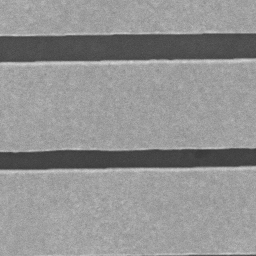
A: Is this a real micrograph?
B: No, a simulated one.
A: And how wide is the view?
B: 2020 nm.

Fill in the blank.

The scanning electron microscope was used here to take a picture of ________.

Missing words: lines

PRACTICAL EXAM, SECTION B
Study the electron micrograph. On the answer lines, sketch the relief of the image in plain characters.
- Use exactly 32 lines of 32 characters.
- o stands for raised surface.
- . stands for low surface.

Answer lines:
oooooooooooooooooooooooooooooooo
oooooooooooooooooooooooooooooooo
oooooooooooooooooooooooooooooooo
oooooooooooooooooooooooooooooooo
................................
................................
................................
........................oooooooo
oooooooooooooooooooooooooooooooo
oooooooooooooooooooooooooooooooo
oooooooooooooooooooooooooooooooo
oooooooooooooooooooooooooooooooo
oooooooooooooooooooooooooooooooo
oooooooooooooooooooooooooooooooo
oooooooooooooooooooooooooooooooo
oooooooooooooooooooooooooooooooo
oooooooooooooooooooooooooooooooo
oooooooooooooooooooooooooooooooo
ooooooooooooooooooooooooooooo...
................................
................................
oooooooooooooooooooooooooooooooo
oooooooooooooooooooooooooooooooo
oooooooooooooooooooooooooooooooo
oooooooooooooooooooooooooooooooo
oooooooooooooooooooooooooooooooo
oooooooooooooooooooooooooooooooo
oooooooooooooooooooooooooooooooo
oooooooooooooooooooooooooooooooo
oooooooooooooooooooooooooooooooo
oooooooooooooooooooooooooooooooo
oooooooooooooooooooooooooooooooo